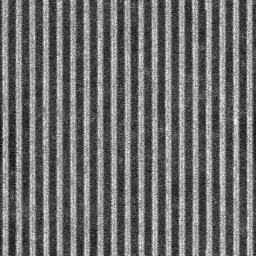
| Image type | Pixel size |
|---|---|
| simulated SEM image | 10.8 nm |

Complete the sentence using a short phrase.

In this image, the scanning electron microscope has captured parallel lines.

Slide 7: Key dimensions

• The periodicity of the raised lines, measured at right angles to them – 147 nm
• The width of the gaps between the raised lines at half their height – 83.8 nm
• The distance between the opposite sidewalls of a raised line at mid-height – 0.0635 um